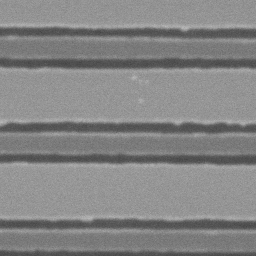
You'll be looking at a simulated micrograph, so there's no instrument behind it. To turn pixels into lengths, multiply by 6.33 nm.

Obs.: lines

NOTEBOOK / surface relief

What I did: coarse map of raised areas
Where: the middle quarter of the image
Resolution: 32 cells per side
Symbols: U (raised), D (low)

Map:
DDDDDDDDDDDDDDDDDDDDDDDDDDDDDDDD
UUUUUUUUUUUUUUUUUUUUUUUUUUUUUUUU
UUUUUUUUUUUUUUUUUUUUUUUUUUUUUUUU
UUUUUUUUUUUUUUUUUUUUUUUUUUUUUUUU
UUUUUUUUUUUUUUUUUUUUUUUUUUUUUUUU
UUUUUUUUUUUUUUUUUUUUUUUUUUUUUUUU
UUUUUUUUUUUUUUUUUUUUUUUUUUUUUUUU
UUUUUUUUUUUUUUUUUUUUUUUUUUUUUUUU
UUUUUUUUUUUUUUUUUUUUUUUUUUUUUUUU
UUUUUUUUUUUUUUUUUUUUUUUUUUUUUUUU
UUUUUUUUUUUUUUUUUUUUUUUUUUUUUUUU
UUUUUUUUUUUUUUUUUUUUUUUUUUUUUUUU
UUUUUUUUUUUUUUUUUUUUUUUUUUUUUUUU
UUUUUUUUUUUUUUUUUUUUUUUUUUUUUUUU
DDDDDDDDDDDDDUDDDDDDDDDDDDDDDDDD
DDDDDDDDDDDDDDDDDDDDDDDDDDDDDDDD
DDDDDDDDDDDDDDDDDDDDDDDDDDDDDDDD
UUUUUUUUUDDDDDDDDUDDDUDDDDDDDDDD
UUUUUUUUUUUUUUUUUUUUUUUUUUUUUUUU
UUUUUUUUUUUUUUUUUUUUUUUUUUUUUUUU
UUUUUUUUUUUUUUUUUUUUUUUUUUUUUUUU
UUUUUUUUUUUUUUUUUUUUUUUUUUUUUUUU
UUUUUDDDDDDUUDDUUUUUUDUUUDUUUUUU
DDDDDDDDDDDDDDDDDDDDDDDDDDDDDDDD
DDDDDDDDDDDDDDDDDDDDDDDDDDDDDDDD
UUUUUUUUUUUUUUUUUUUUUUUUUUUUUUUU
UUUUUUUUUUUUUUUUUUUUUUUUUUUUUUUU
UUUUUUUUUUUUUUUUUUUUUUUUUUUUUUUU
UUUUUUUUUUUUUUUUUUUUUUUUUUUUUUUU
UUUUUUUUUUUUUUUUUUUUUUUUUUUUUUUU
UUUUUUUUUUUUUUUUUUUUUUUUUUUUUUUU
UUUUUUUUUUUUUUUUUUUUUUUUUUUUUUUU